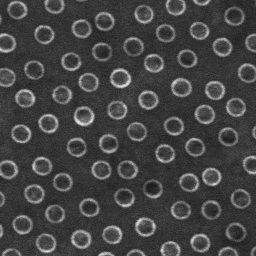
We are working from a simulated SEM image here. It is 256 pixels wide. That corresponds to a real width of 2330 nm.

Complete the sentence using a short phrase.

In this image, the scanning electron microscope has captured a regular array of raised bodies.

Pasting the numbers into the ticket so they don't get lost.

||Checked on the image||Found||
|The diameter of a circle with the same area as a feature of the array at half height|165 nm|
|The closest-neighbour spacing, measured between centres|0.265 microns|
